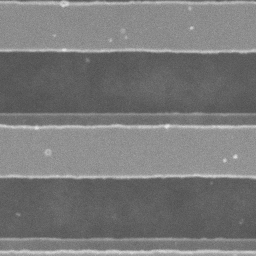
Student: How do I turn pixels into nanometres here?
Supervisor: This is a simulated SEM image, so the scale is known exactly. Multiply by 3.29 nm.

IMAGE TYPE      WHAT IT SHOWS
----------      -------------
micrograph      lines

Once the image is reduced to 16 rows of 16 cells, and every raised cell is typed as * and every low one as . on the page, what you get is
****************
****************
****************
................
................
................
................
................
****************
****************
****************
................
................
................
................
................